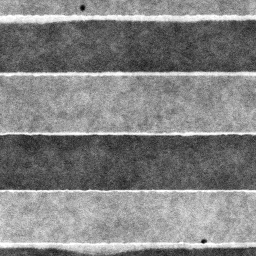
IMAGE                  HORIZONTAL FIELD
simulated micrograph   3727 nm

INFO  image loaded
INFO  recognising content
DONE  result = lines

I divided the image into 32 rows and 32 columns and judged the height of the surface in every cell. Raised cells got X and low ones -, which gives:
XXXXXXXXXXXXXXXXXXXXXXXXXXXXXXXX
XXXXXXXXXXXXXXXXXXXXXXXXXXXXXXXX
--------------------------------
--------------------------------
--------------------------------
--------------------------------
--------------------------------
--------------------------------
--------------------------------
XXXXXXXXXXXXXXXXXXXXXXXXXXXXXXXX
XXXXXXXXXXXXXXXXXXXXXXXXXXXXXXXX
XXXXXXXXXXXXXXXXXXXXXXXXXXXXXXXX
XXXXXXXXXXXXXXXXXXXXXXXXXXXXXXXX
XXXXXXXXXXXXXXXXXXXXXXXXXXXXXXXX
XXXXXXXXXXXXXXXXXXXXXXXXXXXXXXXX
XXXXXXXXXXXXXXXXXXXXXXXXXXXXXXXX
XXXXXXXXXXXXXXXXXXXXXXXXXXXXXXXX
--------------------------------
--------------------------------
--------------------------------
--------------------------------
--------------------------------
--------------------------------
--------------------------------
XXXXXXXXXXXXXXXXXXXXXXXXXXXXXXXX
XXXXXXXXXXXXXXXXXXXXXXXXXXXXXXXX
XXXXXXXXXXXXXXXXXXXXXXXXXXXXXXXX
XXXXXXXXXXXXXXXXXXXXXXXXXXXXXXXX
XXXXXXXXXXXXXXXXXXXXXXXXXXXXXXXX
XXXXXXXXXXXXXXXXXXXXXXXXXXXXXXXX
XXXXXXXXXXXXXXXXXXXXXXXXXXXXXXXX
--------------------------------